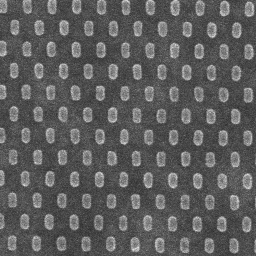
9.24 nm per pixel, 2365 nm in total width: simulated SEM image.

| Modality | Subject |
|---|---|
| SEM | a regular array of raised bodies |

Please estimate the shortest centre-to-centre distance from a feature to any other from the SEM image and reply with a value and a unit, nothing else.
226 nanometres